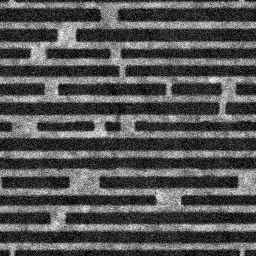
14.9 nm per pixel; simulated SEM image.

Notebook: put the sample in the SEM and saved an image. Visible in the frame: parallel lines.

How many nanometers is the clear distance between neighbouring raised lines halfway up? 183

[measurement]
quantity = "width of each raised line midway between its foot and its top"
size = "97 nm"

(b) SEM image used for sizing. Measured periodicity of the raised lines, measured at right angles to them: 0.277 um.